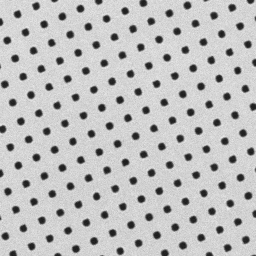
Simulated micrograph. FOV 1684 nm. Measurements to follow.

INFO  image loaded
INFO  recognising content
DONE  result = a regular array of holes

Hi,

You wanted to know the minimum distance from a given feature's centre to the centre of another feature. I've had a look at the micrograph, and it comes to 129 nanometers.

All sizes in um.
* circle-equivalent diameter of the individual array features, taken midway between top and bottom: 0.056